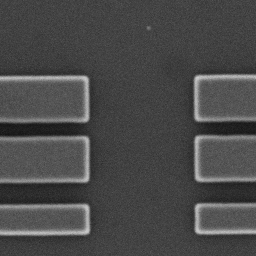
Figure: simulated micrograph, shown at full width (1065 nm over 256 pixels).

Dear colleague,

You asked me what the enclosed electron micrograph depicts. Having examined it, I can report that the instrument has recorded groups of lines, slits or small figures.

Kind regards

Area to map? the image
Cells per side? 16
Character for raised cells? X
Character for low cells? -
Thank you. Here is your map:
----------------
----------------
----------------
----------------
----------------
XXXXX-------XXXX
XXXXX-------XXXX
XXXXX-----------
----------------
XXXXX-------XXXX
XXXXX-------XXXX
----------------
----------------
XXXXX-------XXXX
XXXXX--------XXX
----------------